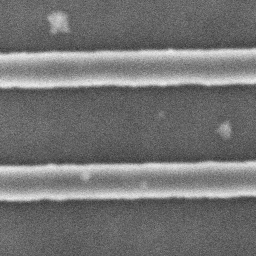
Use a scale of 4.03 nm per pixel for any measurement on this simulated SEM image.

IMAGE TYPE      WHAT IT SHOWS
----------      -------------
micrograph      lines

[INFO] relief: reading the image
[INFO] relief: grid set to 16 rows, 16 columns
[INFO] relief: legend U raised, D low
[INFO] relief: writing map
DDDDDDDDDDDDDDDD
DDDDDDDDDDDDDDDD
DDDDDDDDDDDDDDDD
UUUUUUUUUUUUUUUU
UUUUUUUUUUUUUUUU
DDDDDDDDDDDDDDDD
DDDDDDDDDDDDDDDD
DDDDDDDDDDDDDDDD
DDDDDDDDDDDDDDDD
DDDDDDDDDDDDDDDD
UUUUUUUUUUUUUUUU
UUUUUUUUUUUUUUUU
DDDDDDDDDDDDDDDD
DDDDDDDDDDDDDDDD
DDDDDDDDDDDDDDDD
DDDDDDDDDDDDDDDD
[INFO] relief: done